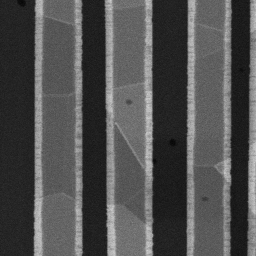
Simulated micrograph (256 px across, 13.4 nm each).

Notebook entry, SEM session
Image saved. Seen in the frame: lines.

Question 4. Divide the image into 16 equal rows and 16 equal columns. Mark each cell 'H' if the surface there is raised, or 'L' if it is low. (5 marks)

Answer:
LLHHHLLHHLLLHHLL
LLHHHLLHHLLLHHLL
LLHHHLLHHLLLHHLL
LLHHHLLHHLLLHHLL
LLHHHLLHHLLLHHLL
LLHHHLLHHLLLHHLL
LLHHHLLHHLLLHHLL
LLHHHLLHHLLLHHLL
LLHHHLLHHLLLHHLL
LLHHHLLHHLLLHHLL
LLHHHLLHHLLLHHLL
LLHHHLLHHLLLHHLL
LLHHHLLHHLLLHHLL
LLHHHLLHHLLLHHLL
LLHHHLLHHLLLHHLL
LLHHHLLHHLLLHHLL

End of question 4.